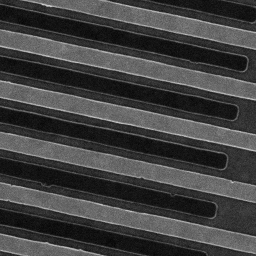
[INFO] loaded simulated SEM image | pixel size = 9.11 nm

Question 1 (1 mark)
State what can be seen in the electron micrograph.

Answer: parallel lines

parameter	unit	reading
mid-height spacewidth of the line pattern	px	8.31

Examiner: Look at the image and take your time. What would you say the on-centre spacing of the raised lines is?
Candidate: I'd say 227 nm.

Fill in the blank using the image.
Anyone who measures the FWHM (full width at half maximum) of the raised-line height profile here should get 150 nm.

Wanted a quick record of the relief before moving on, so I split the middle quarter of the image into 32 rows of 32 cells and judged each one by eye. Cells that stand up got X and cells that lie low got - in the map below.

--------XXXXXXXXXXXXXXXXXXX-----
XX----------XXXXXXXXXXXXXXXXXXXX
XXXXXX-----------XXXXXXXXXXXXXXX
XXXXXXXXXXX-----------XXXXXXXXXX
XXXXXXXXXXXXXXX------------XXXXX
-XXXXXXXXXXXXXXXXXXX------------
-----XXXXXXXXXXXXXXXXXXXX-------
----------XXXXXXXXXXXXXXXXXXXX--
XXXXX----------XXXXXXXXXXXXXXXXX
XXXXXXXXX-----------XXXXXXXXXXXX
XXXXXXXXXXXXXX----------XXXXXXXX
XXXXXXXXXXXXXXXXXXX---------XXXX
----XXXXXXXXXXXXXXXXXXX---------
---------XXXXXXXXXXXXXXXXXXX----
XX-----------XXXXXXXXXXXXXXXXXXX
XXXXXXX-----------XXXXXXXXXXXXXX
XXXXXXXXXXXX-----------XXXXXXXXX
XXXXXXXXXXXXXXXX------------XXXX
--XXXXXXXXXXXXXXXXXXX-----------
-------XXXXXXXXXXXXXXXXXXX------
X----------XXXXXXXXXXXXXXXXXXXX-
XXXXXX----------XXXXXXXXXXXXXXXX
XXXXXXXXXX----------XXXXXXXXXXXX
XXXXXXXXXXXXXXX----------XXXXXXX
XXXXXXXXXXXXXXXXXXXX----------XX
----XXXXXXXXXXXXXXXXXXXX--------
----------XXXXXXXXXXXXXXXXXXX---
XXXX----------XXXXXXXXXXXXXXXXXX
XXXXXXXXX-----------XXXXXXXXXXXX
XXXXXXXXXXXXXX----------XXXXXXXX
XXXXXXXXXXXXXXXXXX-----------XXX
---XXXXXXXXXXXXXXXXXXXX---------